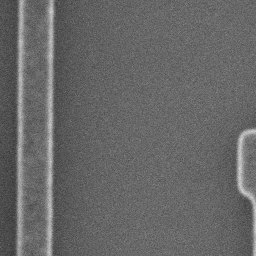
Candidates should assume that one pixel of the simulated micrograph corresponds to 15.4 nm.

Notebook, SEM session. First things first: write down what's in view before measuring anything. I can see wiring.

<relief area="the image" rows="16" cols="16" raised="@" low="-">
-@@-------------
-@@-------------
-@@-------------
-@@-------------
-@@-------------
-@@-------------
-@@-------------
-@@-------------
-@@------------@
-@@------------@
-@@------------@
-@@------------@
-@@-------------
-@@-------------
-@@-------------
-@@-------------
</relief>